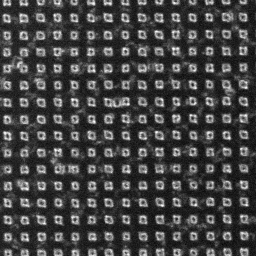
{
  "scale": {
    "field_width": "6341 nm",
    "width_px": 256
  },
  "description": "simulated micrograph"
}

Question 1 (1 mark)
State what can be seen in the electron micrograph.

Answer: holes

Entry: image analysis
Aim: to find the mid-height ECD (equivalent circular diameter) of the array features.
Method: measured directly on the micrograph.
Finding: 74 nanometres